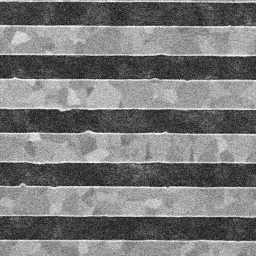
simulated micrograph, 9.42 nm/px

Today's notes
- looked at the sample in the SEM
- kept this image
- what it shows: parallel lines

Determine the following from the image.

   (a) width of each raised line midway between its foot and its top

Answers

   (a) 274 nanometres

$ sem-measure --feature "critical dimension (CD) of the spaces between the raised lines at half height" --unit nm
230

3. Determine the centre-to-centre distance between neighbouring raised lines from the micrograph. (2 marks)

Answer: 505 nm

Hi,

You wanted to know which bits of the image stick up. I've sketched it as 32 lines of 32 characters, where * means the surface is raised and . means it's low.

................................
................................
................................
********************************
********************************
********************************
********************************
................................
................................
................................
********************************
********************************
********************************
.*.*****************************
................................
................................
................................
********************************
********************************
********************************
................**..............
.................*..............
................................
*******************.*****..*****
********************************
********************************
********************************
................................
................................
................................
********************************
********************************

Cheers